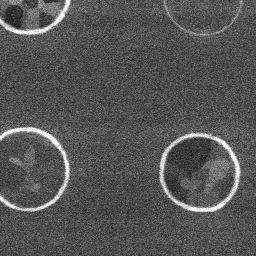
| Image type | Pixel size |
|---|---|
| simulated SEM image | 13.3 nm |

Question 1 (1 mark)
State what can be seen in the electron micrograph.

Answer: raised bodies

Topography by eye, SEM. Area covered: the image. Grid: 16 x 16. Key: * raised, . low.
****............
***.............
................
................
................
................
................
................
***.........*...
****......****..
****......*****.
****......*****.
***........***..
................
................
................